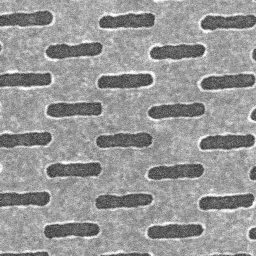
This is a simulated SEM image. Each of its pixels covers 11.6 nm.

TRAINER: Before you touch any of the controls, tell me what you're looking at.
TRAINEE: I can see a regular array of holes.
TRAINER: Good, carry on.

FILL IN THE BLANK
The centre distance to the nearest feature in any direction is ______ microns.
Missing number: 0.676